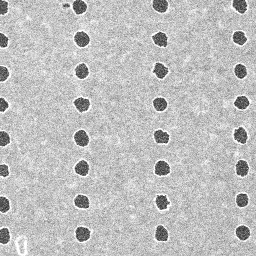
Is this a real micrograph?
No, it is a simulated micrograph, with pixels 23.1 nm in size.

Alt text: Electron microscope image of a regular array of holes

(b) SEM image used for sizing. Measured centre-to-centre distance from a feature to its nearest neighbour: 738 nanometers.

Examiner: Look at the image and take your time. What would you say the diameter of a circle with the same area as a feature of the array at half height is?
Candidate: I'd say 15.5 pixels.